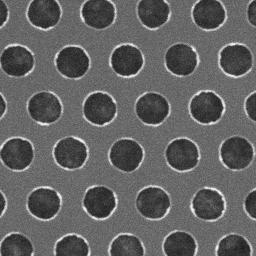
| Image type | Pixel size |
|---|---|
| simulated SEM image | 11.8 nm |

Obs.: a regular array of holes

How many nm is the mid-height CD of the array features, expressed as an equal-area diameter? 389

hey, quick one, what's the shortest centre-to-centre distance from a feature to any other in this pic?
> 633 nanometres